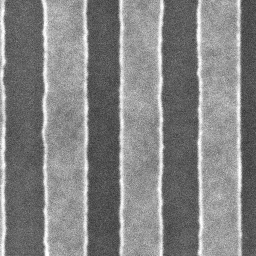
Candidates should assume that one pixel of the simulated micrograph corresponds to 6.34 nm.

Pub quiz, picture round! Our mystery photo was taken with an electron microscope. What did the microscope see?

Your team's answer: lines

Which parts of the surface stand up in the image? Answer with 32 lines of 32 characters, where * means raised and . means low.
*....******....*****.....*****..
......*****....*****.....*****..
......*****....*****.....*****..
*....******....*****.....*****..
......*****....*****.....*****..
......*****....*****.....*****..
......*****....*****.....*****..
*.....*****....*****.....*****..
......*****....*****.....*****..
.....******....*****.....*****..
......*****....*****.....*****..
*.....*****....*****.....*****..
*....******....*****.....*****..
*....******....*****.....*****..
*.....*****....*****.....*****..
*....******....*****.....*****..
*....******....*****.....*****..
*....******....*****.....*****..
......*****....*****.....*****..
......*****....*****.....*****..
*.....*****....*****.....*****..
......*****....*****.....*****..
......*****....*****.....*****..
......*****....*****.....*****..
......*****....*****.....*****..
......*****....*****.....*****..
*.....*****....*****.....*****..
*.....*****....*****.....*****..
*.....*****....*****.....*****..
*.....*****....*****.....*****..
......*****....*****.....*****..
......*****....*****.....*****..